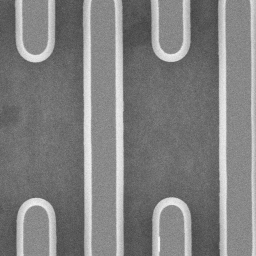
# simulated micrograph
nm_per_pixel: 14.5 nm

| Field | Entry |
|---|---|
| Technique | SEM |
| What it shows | groups of lines, slits or small figures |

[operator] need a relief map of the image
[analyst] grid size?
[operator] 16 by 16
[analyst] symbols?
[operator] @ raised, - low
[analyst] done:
-@@--@@---@@--@@
-@@--@@---@@--@@
-@@--@@---@@--@@
--@--@@---@---@@
-----@@-------@@
-----@@-------@@
-----@@-------@@
-----@@-------@@
-----@@-------@@
-----@@@------@@
-----@@@------@@
-----@@@------@@
-----@@-------@@
-@@--@@@--@@--@@
-@@--@@@--@@--@@
-@@--@@@--@@--@@